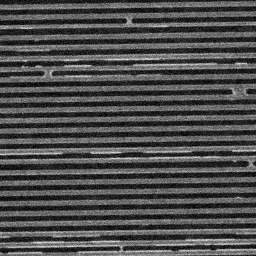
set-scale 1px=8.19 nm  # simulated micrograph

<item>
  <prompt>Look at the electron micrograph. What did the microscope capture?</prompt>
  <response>parallel lines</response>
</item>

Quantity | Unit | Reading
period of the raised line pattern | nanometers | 84.7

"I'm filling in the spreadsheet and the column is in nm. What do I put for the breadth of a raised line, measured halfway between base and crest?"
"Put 37.9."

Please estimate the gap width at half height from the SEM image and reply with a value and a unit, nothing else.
46.1 nm